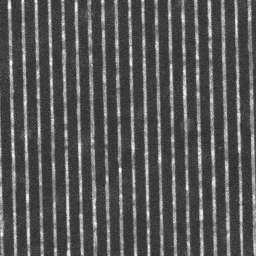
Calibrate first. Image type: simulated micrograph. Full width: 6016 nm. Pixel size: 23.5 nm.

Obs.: parallel lines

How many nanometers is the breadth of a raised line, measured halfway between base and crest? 49.9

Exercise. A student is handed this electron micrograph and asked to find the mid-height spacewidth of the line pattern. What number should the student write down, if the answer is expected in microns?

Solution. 0.264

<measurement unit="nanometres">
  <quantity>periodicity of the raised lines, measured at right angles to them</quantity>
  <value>313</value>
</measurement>